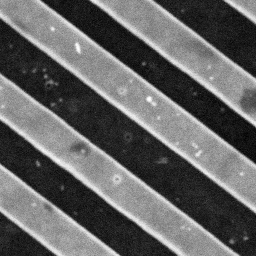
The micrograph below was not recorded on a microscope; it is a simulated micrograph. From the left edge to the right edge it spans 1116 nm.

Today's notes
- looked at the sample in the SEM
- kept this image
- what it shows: lines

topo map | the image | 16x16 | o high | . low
ooo...oooo.....o
oooo....ooo.....
..oooo...oooo...
...oooo...oooo..
....oooo....ooo.
o.....oooo...ooo
ooo....oooo...oo
oooo....oooo...o
.oooo.....oooo..
...ooo.....oooo.
....oooo....oooo
oo...oooo.....oo
ooo....ooo.....o
oooo....oooo....
..oooo...oooo...
...oooo....ooo..